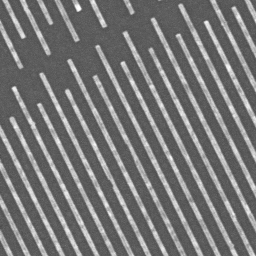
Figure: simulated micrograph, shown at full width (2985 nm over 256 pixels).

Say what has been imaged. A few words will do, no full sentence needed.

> parallel lines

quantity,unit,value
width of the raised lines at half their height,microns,0.0327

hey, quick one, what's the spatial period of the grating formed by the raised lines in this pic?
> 181 nanometres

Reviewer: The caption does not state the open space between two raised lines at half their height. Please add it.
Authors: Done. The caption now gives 149 nm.